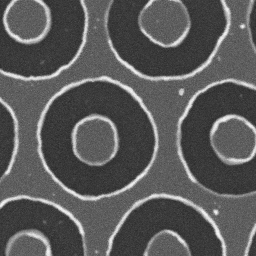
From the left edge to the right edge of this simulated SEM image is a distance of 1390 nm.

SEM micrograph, ring-shaped grooves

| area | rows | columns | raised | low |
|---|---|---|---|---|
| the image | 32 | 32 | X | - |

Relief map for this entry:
-XXXXX----XXXX----XXXXX-----XXX-
-XXXXX-----XXX----XXXXX-----XXX-
XXXXXX-----XX----XXXXXXX----XXX-
-XXXXX-----XX-----XXXXXX----XXX-
-XXXXX----XXXX----XXXXX-----XXX-
----------XXXX------XX-----XXXXX
----------XXXX-------------XXXXX
---------XXXXXX-----------XXXXXX
--------XXXXXXXXX--------XXXXXXX
XXX--XXXXXXXXXXXXX----XXXXXXXXXX
XXXXXXXXXX-----XXXXXXXXXXXX---XX
XXXXXXXX--------XXXXXXXXX-------
XXXXXXX----------XXXXXXX--------
-XXXXX------------XXXXXX--------
--XXXX-----XX-----XXXXX-----XX--
--XXX-----XXXX-----XXXX----XXXX-
--XXX----XXXXXX----XXX----XXXXXX
--XXX----XXXXXX----XXX----XXXXXX
--XXX----XXXXXX----XXXX----XXXXX
-XXXX-----XXXX-----XXXX----XXXXX
-XXXXX-----XX------XXXX------X--
-XXXXX------------XXXXXX--------
XXXXXXX----------XXXXXXXX-------
XXXXXXXX-------XXXXXXXXXXX------
XXXXXXXXXXXXXXXXXXXXXXXXXXXXXXXX
X-----XXXXXXXXXXXX-----XXXXXXXXX
--------XXXXXXXX---------XXXXXXX
---------XXXXXXX----------XXXXXX
----------XXXXX------------XXXXX
--XXX-----XXXX-----XXX-----XXXXX
-XXXXX----XXXX-----XXXX-----XXX-
-XXXXX-----XXX----XXXXXX----XXX-